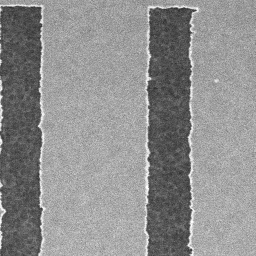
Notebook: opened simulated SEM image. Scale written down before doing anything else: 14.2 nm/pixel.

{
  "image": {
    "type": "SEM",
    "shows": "one or a few lines or trenches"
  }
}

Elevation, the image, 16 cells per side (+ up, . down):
..++++++++..++++
...++++++...++++
...++++++...++++
...++++++...++++
...++++++...++++
...++++++...++++
...++++++...++++
...++++++...++++
...++++++...++++
...++++++...++++
..+++++++...++++
...++++++...++++
...++++++...++++
...++++++...++++
...++++++...++++
...++++++...++++